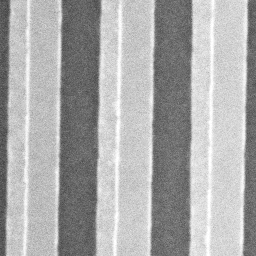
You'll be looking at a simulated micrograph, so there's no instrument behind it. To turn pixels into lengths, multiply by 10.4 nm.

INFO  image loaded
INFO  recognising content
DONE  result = lines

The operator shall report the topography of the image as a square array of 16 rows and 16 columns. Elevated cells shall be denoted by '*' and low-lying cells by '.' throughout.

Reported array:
.***..****..***.
.***..****..***.
.***..****..***.
.***..****..***.
.***..****..***.
.***..****..***.
.***..****..***.
.***..***...***.
.***..***...***.
.***..***...***.
.***..***...***.
.***..***...***.
.***..***...***.
****..***...***.
****..***...***.
****..***...***.